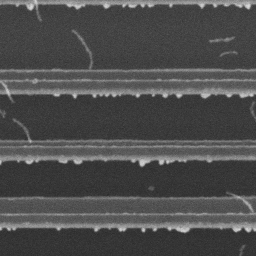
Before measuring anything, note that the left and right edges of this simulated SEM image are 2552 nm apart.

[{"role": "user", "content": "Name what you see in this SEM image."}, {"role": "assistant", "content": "lines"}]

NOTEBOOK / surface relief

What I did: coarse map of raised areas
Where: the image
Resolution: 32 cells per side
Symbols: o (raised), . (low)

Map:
..ooo...ooo.oooooooo.o...ooooooo
................................
................................
................................
................................
................................
................................
................................
................................
oooooooooooooooooooooooooooooooo
oooooooooooooooooooooooooooooooo
oooooooooooooooooooooooooooooooo
................................
................................
................................
................................
................................
................................
oooooooooooooooooooooooooooooooo
oooooooooooooooooooooooooooooooo
................................
................................
................................
................................
................................
oooooooooooooooooooooooooooooooo
oooooooooooooooooooooooooooooooo
oooooooooooooooooooooooooooooooo
oo.....o...ooooo.ooooooo...o.ooo
................................
................................
................................